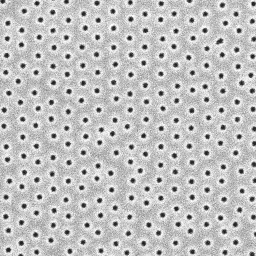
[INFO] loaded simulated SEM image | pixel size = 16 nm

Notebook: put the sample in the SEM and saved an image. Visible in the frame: a regular array of holes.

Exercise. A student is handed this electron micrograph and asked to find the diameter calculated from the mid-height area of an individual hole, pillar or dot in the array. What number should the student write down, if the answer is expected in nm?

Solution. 97.4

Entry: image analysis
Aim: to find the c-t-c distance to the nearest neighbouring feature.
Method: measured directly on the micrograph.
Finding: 245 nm